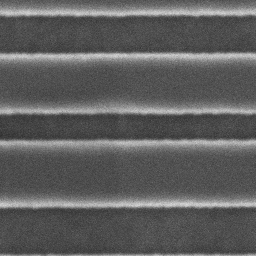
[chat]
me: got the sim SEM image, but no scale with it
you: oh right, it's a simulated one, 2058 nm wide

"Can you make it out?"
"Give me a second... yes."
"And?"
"lines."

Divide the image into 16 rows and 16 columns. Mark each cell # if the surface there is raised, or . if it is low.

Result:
################
................
................
################
################
################
################
................
................
################
################
################
################
................
................
................